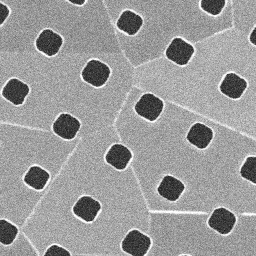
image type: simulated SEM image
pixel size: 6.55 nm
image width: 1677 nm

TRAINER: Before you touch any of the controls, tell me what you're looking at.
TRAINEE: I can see a regular array of holes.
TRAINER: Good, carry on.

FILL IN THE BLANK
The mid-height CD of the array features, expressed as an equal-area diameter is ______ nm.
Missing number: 170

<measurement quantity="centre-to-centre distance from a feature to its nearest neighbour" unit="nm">383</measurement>